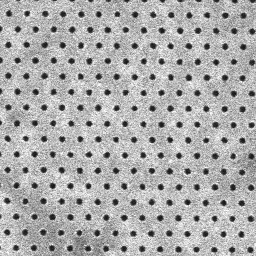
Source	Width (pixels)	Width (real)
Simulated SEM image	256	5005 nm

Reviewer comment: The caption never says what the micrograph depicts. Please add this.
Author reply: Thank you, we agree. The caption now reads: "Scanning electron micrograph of a regular array of holes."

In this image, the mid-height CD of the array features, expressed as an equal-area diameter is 0.132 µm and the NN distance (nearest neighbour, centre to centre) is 342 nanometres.